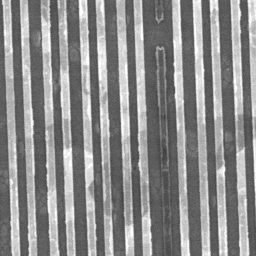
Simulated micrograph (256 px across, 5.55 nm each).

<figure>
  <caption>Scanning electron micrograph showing parallel lines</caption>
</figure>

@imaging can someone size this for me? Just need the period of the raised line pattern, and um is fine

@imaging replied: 0.105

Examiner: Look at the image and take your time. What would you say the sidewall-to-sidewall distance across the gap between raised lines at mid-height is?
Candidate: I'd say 52.7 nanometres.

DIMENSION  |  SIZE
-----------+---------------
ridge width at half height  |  42.3 nanometres